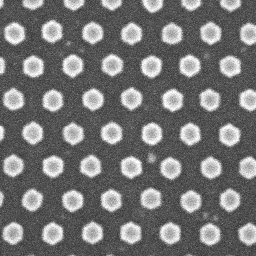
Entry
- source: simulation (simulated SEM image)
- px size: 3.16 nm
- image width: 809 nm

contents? a regular array of raised bodies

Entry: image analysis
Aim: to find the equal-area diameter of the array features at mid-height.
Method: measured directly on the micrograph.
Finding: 60.4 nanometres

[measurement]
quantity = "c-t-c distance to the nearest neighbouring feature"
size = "119 nm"